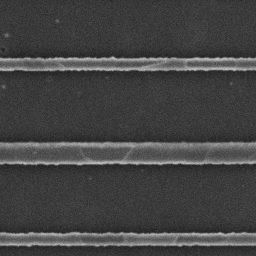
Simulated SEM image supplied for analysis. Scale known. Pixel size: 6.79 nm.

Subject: lines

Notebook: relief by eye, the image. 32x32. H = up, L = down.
LLLLLLLLLLLLLLLLLLLLLLLLLLLLLLLL
LLLLLLLLLLLLLLLLLLLLLLLLLLLLLLLL
LLLLLLLLLLLLLLLLLLLLLLLLLLLLLLLL
LLLLLLLLLLLLLLLLLLLLLLLLLLLLLLLL
LLLLLLLLLLLLLLLLLLLLLLLLLLLLLLLL
LLLLLLLLLLLLLLLLLLLLLLLLLLLLLLLL
LLLLLLLLLLLLLLLLLLLLLLLLLLLLLLLL
HHHHHHHHHHHHHHHHHHHHHHHHHHHHHHHH
HHHHHHHHHHHHHHHHHHHHHHHHHHHHHHHH
LLLLLLLLLLLLLLLLLLLLLLLLLLLLLLLL
LLLLLLLLLLLLLLLLLLLLLLLLLLLLLLLL
LLLLLLLLLLLLLLLLLLLLLLLLLLLLLLLL
LLLLLLLLLLLLLLLLLLLLLLLLLLLLLLLL
LLLLLLLLLLLLLLLLLLLLLLLLLLLLLLLL
LLLLLLLLLLLLLLLLLLLLLLLLLLLLLLLL
LLLLLLLLLLLLLLLLLLLLLLLLLLLLLLLL
LLLLLLLLLLLLLLLLLLLLLLLLLLLLLLLL
LLLLLLLLLLLLLLLLLLLLLLLLLLLLLLLL
HHHHHHHHHHHHHHHHHHHHHHHHHHHHHHHH
HHHHHHHHHHHHHHHHHHHHHHHHHHHHHHHH
LLLLLLHHLHLLLLLLLLLLLLLLLLLLLLLL
LLLLLLLLLLLLLLLLLLLLLLLLLLLLLLLL
LLLLLLLLLLLLLLLLLLLLLLLLLLLLLLLL
LLLLLLLLLLLLLLLLLLLLLLLLLLLLLLLL
LLLLLLLLLLLLLLLLLLLLLLLLLLLLLLLL
LLLLLLLLLLLLLLLLLLLLLLLLLLLLLLLL
LLLLLLLLLLLLLLLLLLLLLLLLLLLLLLLL
LLLLLLLLLLLLLLLLLLLLLLLLLLLLLLLL
LLLLLLLLLLLLLLLLLLLLLLLLLLLLLLLL
HHHHHHHHHHHHHHHHHHHHHHHHHHHHHHHH
HHHHHHHHHHHHHHHHHHHHHHHHHHHHHHHH
LLLLLLLLLLLLLLLLLLLLLLLLLLLLLLLL